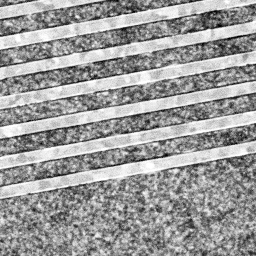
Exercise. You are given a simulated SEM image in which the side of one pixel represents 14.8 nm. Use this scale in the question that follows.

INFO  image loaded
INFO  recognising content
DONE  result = parallel lines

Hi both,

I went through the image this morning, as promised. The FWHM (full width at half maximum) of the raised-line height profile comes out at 154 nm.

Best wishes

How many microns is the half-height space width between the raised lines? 0.28